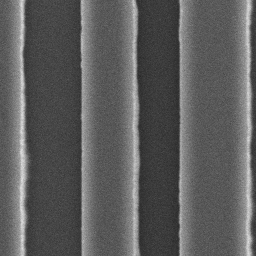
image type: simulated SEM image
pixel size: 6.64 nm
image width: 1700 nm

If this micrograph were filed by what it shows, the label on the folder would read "lines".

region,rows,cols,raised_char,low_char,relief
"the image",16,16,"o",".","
o....ooo...ooooo
o....ooo...ooooo
o....ooo...ooooo
o....ooo...ooooo
o....ooo...ooooo
o....ooo...ooooo
o....ooo...ooooo
o....ooo...ooooo
o....ooo...ooooo
o....oooo..ooooo
o....oooo..ooooo
o....ooo...ooooo
o....ooo...ooooo
o....ooo...ooooo
o....ooo...ooooo
o....oooo..ooooo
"